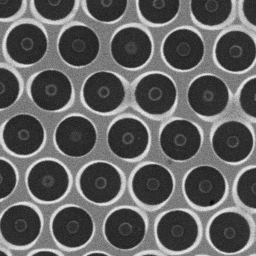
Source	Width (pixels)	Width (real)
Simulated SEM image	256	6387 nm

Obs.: an array of small figures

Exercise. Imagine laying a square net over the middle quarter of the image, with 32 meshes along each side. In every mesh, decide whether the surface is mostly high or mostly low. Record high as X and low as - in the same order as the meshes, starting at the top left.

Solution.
XX---XXXXXXXXX------XXXXXX------
XXXXXXXXXXXXXXXXXXXXXXXXXXXX---X
XXXXXXX------XXXXXXXX----XXXXXXX
-XXXXX--------XXXXX-------XXXXXX
--XXX----------XXX---------XXXXX
--XXX-----------X-----------XXX-
--XXX-----------X-----------XXX-
--XX------------------------XXX-
--XX------------------------XXX-
--XXX-----------X-----------XXX-
-XXXXX---------XXX----------XXX-
XXXXXXX-------XXXXX--------XXXXX
XXXXXXXXXXXXXXXXXXXX------XXXXXX
------XXXXXXXX----XXXXXXXXXXXXXX
-------XXXXX--------XXXXXX------
--------XXXX--------XXXXX-------
--------XXX----------XXX--------
--------XXX----------XXX--------
--------XXX----------XXX--------
--------XXX----------XXX--------
--------XXX----------XXX--------
-------XXXXX---------XXXX-------
------XXXXXXX-------XXXXX-------
XXXXXXXXXXXXXX-----XXXXXXX------
XXXXXXX---XXXXXXXXXXXXXXXXXXXXXX
XXXXX-------XXXXXXX------XXXXXXX
-XXX----------XXXX--------XXXXXX
-XXX----------XXX----------XXXX-
--XX-----------XX----------XXX--
--X------------XX-----------XX--
-XX------------XX----------XXX--
-XXX----------XXX----------XXX--